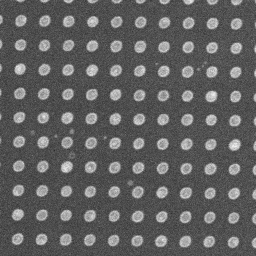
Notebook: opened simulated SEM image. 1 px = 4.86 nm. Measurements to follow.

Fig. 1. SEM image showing a regular array of raised bodies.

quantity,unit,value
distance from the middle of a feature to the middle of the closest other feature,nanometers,116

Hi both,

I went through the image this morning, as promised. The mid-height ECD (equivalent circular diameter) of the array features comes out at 51.1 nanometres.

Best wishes